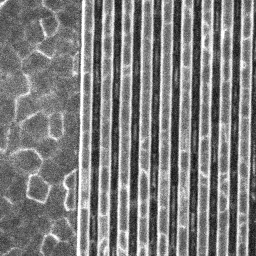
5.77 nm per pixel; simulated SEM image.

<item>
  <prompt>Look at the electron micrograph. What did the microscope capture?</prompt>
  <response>parallel lines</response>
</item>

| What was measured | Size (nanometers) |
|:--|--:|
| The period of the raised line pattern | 114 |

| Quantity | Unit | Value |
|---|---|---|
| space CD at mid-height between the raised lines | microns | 0.0519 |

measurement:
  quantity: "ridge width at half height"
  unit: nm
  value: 62.7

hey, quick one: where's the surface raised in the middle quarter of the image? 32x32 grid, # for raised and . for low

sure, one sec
.....##...##...##..###..###..###
.....##...##..###..###..###..###
.....##...##..###..###..###..###
.....##..###..###..###..###..###
.....##..###..###..###..###..###
....###..###..###..###..###..###
....###..###..###..###..###..###
....###..###..###..###..###..###
....###..###..###..###..###..###
....###..###..###..###..###..###
....###..###..###..###..###..###
....###..###..###..###..###..###
....###..###..###..###..###..###
....###..###..###..###..###..###
....###..###..##...###..###..###
....###..###..##...###..###..###
....###..###..##...###..##...###
....###..###..###..###..###..###
....###..###..###..###..###..###
....###..###..###..###..###..##.
....###..###..###..###..###..##.
....###..###..###..###..##...##.
....###..###..##...###..##...##.
....###..###..##...##...##...##.
....###..###..##...##...##...##.
....###..###..##...##...##...##.
....###..##...##...##...##...##.
....###..##...##...##...##...##.
....##...##...##...##...##...##.
....##...##...##...##...##...##.
....##...##...##...##...##...##.
....##...##...##...##...##...##.